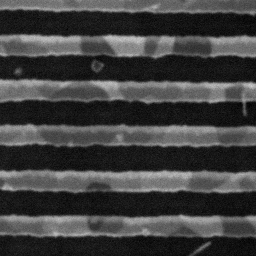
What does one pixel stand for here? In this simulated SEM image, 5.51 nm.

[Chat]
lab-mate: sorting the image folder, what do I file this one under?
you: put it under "lines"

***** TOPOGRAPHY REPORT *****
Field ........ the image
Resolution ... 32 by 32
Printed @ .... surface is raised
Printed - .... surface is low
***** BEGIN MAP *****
@@@@@@@@@@@@@@@@@@@@@@@@@@@@@@@@
----------------@--@@@@@@@@@@@@@
--------------------------------
--------------------------------
--------------------------------
@@@@@@@@@@@@@@@@@@@@@@@@@@@@@@@@
@@@@@@@@@@@@@@@@@@@@@@@@@@@@@@@@
--------------------------------
--------------------------------
--------------------------------
@@@@@@@@@@@@@@@@@@@@@@@@-----@@@
@@@@@@@@@@@@@@@@@@@@@@@@@@@@@@@@
@@@---@---@@----@@@@@@@@@@@@@@@@
--------------------------------
--------------------------------
--------------------------------
@@@@@@@@@@@@@@@@@@@@@@@@@@@@@@@@
@@@@@@@@@@@@@@@@@@@@@@@@@@@@@@@@
--------------------------------
--------------------------------
--------------------------------
--------------------------------
@@@@@@@@@@@@@@@@@@@@@@@@@@@@@@@@
@@@@@@@@@@@@@@@@@@@@@@@@@@@@@@@@
--------------------------------
--------------------------------
--------------------------------
@@@@@@@@@@@@@@@@@@@@@@@@@@@@@@@@
@@@@@@@@@@@@@@@@@@@@@@@@@@@@@@@@
----@---------@-----@--@@@--@@@@
--------------------------------
--------------------------------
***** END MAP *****